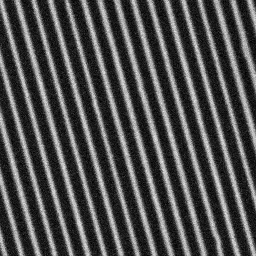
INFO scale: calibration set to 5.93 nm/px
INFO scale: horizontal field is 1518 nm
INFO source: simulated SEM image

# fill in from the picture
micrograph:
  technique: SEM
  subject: parallel lines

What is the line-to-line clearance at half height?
72.2 nm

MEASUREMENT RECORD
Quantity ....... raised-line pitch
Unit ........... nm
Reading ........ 94.9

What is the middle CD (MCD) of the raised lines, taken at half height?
4.57 px